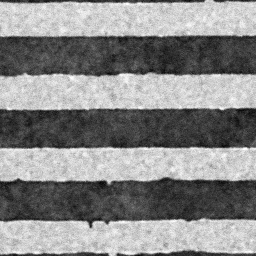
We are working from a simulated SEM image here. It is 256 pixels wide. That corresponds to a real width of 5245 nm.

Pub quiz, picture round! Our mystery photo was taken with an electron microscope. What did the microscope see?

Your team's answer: one or a few lines or trenches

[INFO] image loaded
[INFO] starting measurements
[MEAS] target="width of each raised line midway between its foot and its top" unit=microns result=0.653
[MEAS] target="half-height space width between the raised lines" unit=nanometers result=817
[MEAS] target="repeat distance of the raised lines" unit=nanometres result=1490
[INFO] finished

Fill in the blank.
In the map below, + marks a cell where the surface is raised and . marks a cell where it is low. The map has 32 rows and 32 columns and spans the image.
+++++++++++++++...++++++++++++++
++++++++++++++++++++++++++++++++
++++++++++++++++++++++++++++++++
++++++++++++++++++++++++++++++++
................................
................................
................................
................................
................................
...+.++++.+..+.+++++++++++++++++
++++++++++++++++++++++++++++++++
++++++++++++++++++++++++++++++++
++++++++++++++++++++++++++++++++
++++++++++++++.............+....
................................
................................
................................
................................
.................+..............
++++++++++++++++++++++++++++++++
++++++++++++++++++++++++++++++++
++++++++++++++++++++++++++++++++
++.+.+++++++++....+........++++.
................................
................................
................................
................................
.........................+......
++++++++++++++++++++++++++++++++
++++++++++++++++++++++++++++++++
++++++++++++++++++++++++++++++++
++++++++++.++++++++++.....+++..+